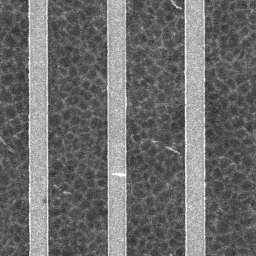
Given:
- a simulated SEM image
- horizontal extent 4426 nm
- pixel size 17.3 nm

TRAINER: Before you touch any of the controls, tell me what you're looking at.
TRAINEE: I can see one or a few lines or trenches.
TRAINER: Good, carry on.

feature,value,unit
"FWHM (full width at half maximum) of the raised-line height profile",18.5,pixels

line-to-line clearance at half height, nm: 1040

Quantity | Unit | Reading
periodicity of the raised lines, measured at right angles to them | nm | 1360